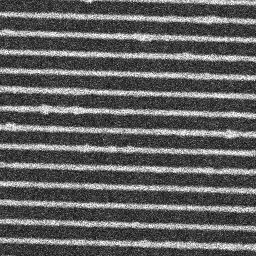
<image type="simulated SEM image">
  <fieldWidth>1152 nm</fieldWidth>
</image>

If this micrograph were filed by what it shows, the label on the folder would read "parallel lines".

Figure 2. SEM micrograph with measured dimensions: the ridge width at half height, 21.3 nanometers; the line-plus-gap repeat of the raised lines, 18.8 pixels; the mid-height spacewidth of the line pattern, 62.9 nm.